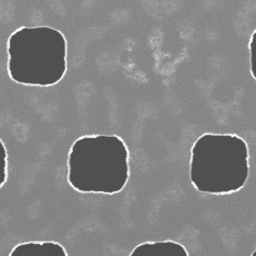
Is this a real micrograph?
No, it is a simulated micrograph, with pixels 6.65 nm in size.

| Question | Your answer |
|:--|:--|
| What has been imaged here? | holes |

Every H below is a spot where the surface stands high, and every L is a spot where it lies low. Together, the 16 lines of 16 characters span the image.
HHHHHHHHHHHHHHHH
HHHHHHHHHHHHHHHH
HLLLHHHHHHHHHHHH
HLLLHHHHHHHHHHHH
HLLLHHHHHHHHHHHH
HHHHHHHHHHHHHHHH
HHHHHHHHHHHHHHHH
HHHHHHHHHHHHHHHH
HHHHHHHHHHHHHLHH
HHHHLLLLHHHHLLLH
HHHHLLLLHHHHLLLH
HHHHHLLLHHHHLLLH
HHHHHHHHHHHHHHHH
HHHHHHHHHHHHHHHH
HHHHHHHHHHHHHHHH
HLLLHHHHHLLHHHHH